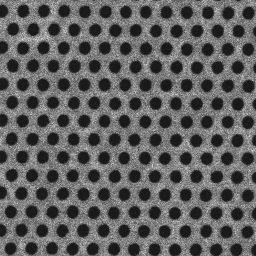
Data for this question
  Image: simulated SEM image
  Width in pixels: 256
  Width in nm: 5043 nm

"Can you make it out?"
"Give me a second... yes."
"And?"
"a regular array of holes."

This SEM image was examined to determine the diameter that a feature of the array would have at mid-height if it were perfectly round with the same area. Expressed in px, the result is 12.6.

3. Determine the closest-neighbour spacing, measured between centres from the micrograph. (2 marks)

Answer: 398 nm